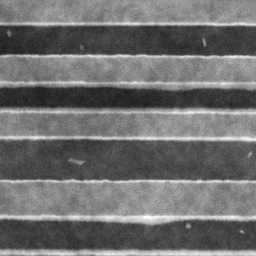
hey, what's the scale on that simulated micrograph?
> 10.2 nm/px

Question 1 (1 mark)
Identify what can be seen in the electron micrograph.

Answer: lines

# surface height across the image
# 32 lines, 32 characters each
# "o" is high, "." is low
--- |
oooooooooooooooooooooooooooooooo
oooooooooooooooooooooooooooooooo
oooooooooooooooooooooooooooooooo
................................
................................
................................
................................
oooooooooooooooooooooooooooooooo
oooooooooooooooooooooooooooooooo
oooooooooooooooooooooooooooooooo
..........ooo.oooooooooooooooooo
................................
................................
................................
oooooooooooooooooooooooooooooooo
oooooooooooooooooooooooooooooooo
oooooooooooooooooooooooooooooooo
................................
................................
................................
................................
................................
................................
oooooooooooooooooooooooooooooooo
oooooooooooooooooooooooooooooooo
oooooooooooooooooooooooooooooooo
oooooooooooooooooooooooooooooooo
................................
................................
................................
................................
................................